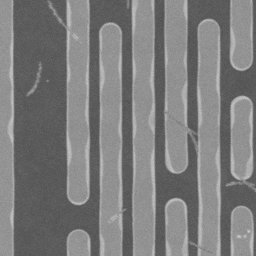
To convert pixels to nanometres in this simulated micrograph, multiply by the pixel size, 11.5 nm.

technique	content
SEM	groups of lines, slits or small figures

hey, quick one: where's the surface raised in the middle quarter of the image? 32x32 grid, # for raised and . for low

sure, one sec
.#####...#####...#####...#####..
.#####....####....####...######.
.#####....####...#####...######.
.#####....####...#####...######.
.#####....####...#####...######.
.#####...#####...#####....#####.
.#####...#####...#####....####..
.#####...#####...#####....####..
.#####...#####...#####....####..
.#####...#####...#####....####..
.#####...#####...#####....####..
.#####...#####...#####...#####..
.#####...#####...#####...#####..
.#####...#####...#####...#####..
.#####...#####...#####...######.
.#####...#####....####...######.
.#####...#####....####...######.
.#####...#####...######..######.
.#####...#####...#####....#####.
.#####...#####...#####....#####.
.#####...#####...#####....#####.
.#####...#####...#####....#####.
.#####...#####...#####....#####.
.#####...#####...#####....#####.
.#####...#####....####....#####.
.#####...#####....####....#####.
.#####...#####....####.....###..
.#####...#####...#####..........
.#####...#####...#####..........
.#####...#####...#####..........
.#####...#####...#####..........
.#####...#####...#####..........